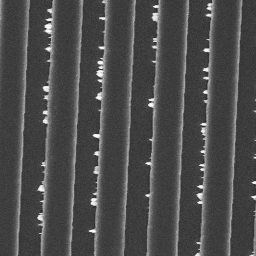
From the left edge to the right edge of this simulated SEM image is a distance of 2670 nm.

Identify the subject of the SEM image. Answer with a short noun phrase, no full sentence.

lines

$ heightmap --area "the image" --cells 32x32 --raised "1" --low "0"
11110001110001111000111100111100
11110011110001111000111000111100
11100011110001111001111000111100
11100011110001111000111000111100
11100011110001111000111000111100
11100011110001111000111000111100
11100011110001111000111000111100
11100011110001110000111000111100
11100011110001110000111000111100
11100011110011110000111000111100
11100011110001110001111000111100
11100011110001110001111000111100
11100011110001110001111000111100
11100011110001110001111000111100
11100011110001110001111000111000
11100011110001110001111000111000
11100011110011110001111000111000
11100011110011110001111000111000
11100011100011110001111000111000
11100011100011110001111000111000
11100011100011110001111000111000
11100011100011110001110000111000
11100011100011110001110000111000
11000111100011110001110001111000
11000011100011110001110001111000
11000011100011110001110001111000
11000111100011110001110001111000
11000111100011110001110001111000
11000111100011110001110001111000
11000111100011100001110001111000
11000111100011100011110001111000
11000111100011100011110001111000